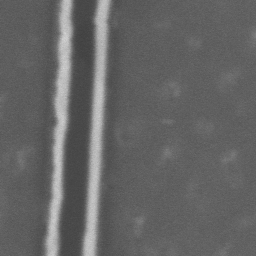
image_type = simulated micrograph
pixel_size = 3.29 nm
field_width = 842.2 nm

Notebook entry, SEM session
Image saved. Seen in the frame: one or a few lines or trenches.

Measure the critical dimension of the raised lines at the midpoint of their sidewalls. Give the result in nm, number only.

128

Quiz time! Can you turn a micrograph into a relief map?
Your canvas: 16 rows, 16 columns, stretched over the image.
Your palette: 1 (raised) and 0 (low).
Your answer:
0000111000000000
0000110000000000
0000110000000000
0000110000000000
0000110000000000
0000110000000000
0000110000000000
0000110000000000
0000110000000000
0000110000000000
0000110000000000
0000110000000000
0001110000000000
0001110000000000
0001110000000000
0001110000000000